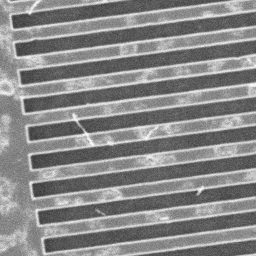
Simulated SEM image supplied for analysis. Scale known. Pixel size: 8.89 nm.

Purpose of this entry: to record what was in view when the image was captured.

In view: parallel lines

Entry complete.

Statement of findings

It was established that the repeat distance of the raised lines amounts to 28.2 pixels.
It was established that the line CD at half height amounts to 117 nm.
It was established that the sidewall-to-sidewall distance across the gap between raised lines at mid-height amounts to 133 nanometres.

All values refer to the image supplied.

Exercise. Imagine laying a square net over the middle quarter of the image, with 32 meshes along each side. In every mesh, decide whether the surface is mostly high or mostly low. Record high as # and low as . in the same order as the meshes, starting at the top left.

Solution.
...........................#####
....................############
............####################
.....########################...
#####################...........
##############..................
######..........................
............................####
...................#############
.............###################
.....#########################..
######################..........
##############..................
#######.........................
.............................###
......................##########
..............##################
.....##########################.
#######################.........
###############.................
########........................
..............................##
.......................#########
...............#################
.......########################.
########################........
################................
#########.......................
#..............................#
.......................#########
................################
........########################